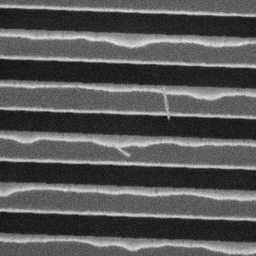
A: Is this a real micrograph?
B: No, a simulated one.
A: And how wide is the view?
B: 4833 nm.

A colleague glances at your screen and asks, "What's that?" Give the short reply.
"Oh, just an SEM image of lines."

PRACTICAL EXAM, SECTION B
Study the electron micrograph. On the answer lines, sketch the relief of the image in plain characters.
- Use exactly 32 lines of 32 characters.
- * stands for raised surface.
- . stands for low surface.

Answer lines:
********************************
.................***************
................................
................................
************....................
********************************
********************************
....****************************
................................
................................
****............................
*************************..****.
********************************
********************************
.....................*..********
................................
................................
**************.....***..........
********************************
********************************
...........*********************
................................
................................
.*********......................
********************************
********************************
.*******************************
...............................*
................................
................................
**************************......
********************************